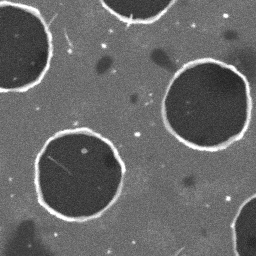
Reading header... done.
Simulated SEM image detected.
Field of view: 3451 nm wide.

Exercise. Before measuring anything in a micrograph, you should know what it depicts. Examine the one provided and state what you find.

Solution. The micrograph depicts holes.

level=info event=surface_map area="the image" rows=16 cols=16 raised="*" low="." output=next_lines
.******...******
...*************
...*************
...*************
...********....*
.**********....*
**********.....*
**********.....*
****..*****....*
***....*********
**......********
**......********
***....*********
****..*********.
***************.
***************.